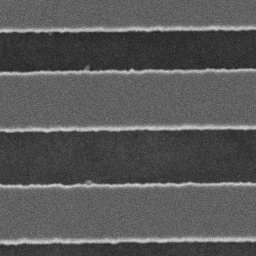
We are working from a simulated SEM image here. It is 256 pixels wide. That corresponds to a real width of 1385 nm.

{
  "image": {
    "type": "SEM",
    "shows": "lines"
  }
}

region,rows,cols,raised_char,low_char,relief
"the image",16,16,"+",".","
++++++++++++++++
++++++++++++++++
................
................
..++++++++++++++
++++++++++++++++
++++++++++++++++
++++++++++++++++
................
................
................
........++++++++
++++++++++++++++
++++++++++++++++
++++++++++++++++
................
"